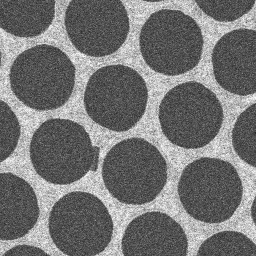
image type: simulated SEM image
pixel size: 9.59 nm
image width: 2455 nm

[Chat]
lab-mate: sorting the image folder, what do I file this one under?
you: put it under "holes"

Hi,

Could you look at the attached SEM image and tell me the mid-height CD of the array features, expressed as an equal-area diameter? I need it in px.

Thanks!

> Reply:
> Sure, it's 65.9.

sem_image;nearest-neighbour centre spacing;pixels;75.6